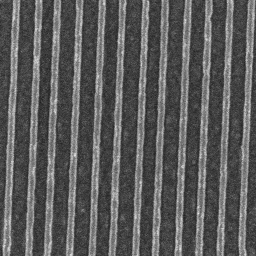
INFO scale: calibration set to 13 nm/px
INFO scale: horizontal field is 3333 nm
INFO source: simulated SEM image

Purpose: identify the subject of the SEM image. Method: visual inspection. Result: parallel lines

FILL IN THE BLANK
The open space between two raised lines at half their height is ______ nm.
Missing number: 205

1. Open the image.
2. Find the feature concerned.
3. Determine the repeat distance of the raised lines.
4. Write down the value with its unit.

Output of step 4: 278 nanometres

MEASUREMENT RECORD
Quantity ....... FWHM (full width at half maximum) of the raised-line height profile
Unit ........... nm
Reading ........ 79.7